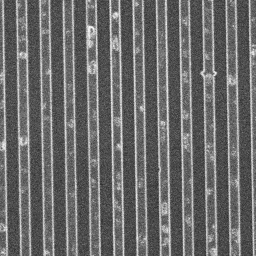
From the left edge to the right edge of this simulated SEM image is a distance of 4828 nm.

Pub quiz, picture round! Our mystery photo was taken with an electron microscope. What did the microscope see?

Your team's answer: parallel lines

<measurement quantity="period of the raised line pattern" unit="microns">0.439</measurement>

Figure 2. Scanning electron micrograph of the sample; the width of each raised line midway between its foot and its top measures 186 nm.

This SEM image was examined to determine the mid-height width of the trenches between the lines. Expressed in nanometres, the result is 252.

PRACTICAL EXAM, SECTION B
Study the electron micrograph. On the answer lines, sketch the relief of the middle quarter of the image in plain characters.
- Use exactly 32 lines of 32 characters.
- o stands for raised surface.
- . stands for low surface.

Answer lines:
oo....oo....oo....oo....oo...ooo
oo....oo....oo....oo....oo...ooo
oo....oo....oo....oo....oo...ooo
oo....oo....oo....oo....oo...ooo
oo....oo....oo....oo....oo...ooo
oo....oo....oo....oo....oo...ooo
oo....oo....oo....oo....oo...ooo
oo....oo....oo....oo....oo...ooo
oo....oo....oo....oo....oo...ooo
oo....oo....oo....oo....oo...ooo
ooo...oo....oo....oo....oo....oo
ooo...oo....oo....oo....oo....oo
ooo...oo....oo....oo....oo....oo
ooo...oo....oo....oo....oo....oo
ooo...oo....oo....oo....oo....oo
ooo...oo....oo....oo....oo....oo
ooo...oo....oo....oo....oo....oo
ooo...oo....oo....oo....oo....oo
ooo...oo....oo....oo....oo....oo
ooo...oo....oo....oo....oo....oo
ooo...oo....oo....oo....oo....oo
ooo...oo....ooo...oo....oo....oo
ooo...oo....ooo...oo....oo....oo
.oo...ooo...ooo...oo....oo....oo
.oo...ooo...ooo...oo....oo....oo
.oo...ooo...ooo...oo....oo....oo
.oo...ooo...ooo...oo....oo....oo
.oo...ooo...ooo...oo....oo....oo
.oo...ooo...ooo...oo....oo....oo
.oo...ooo...ooo...oo....oo....oo
.oo...ooo...ooo...oo....oo....oo
.oo...ooo...ooo...oo....oo....oo